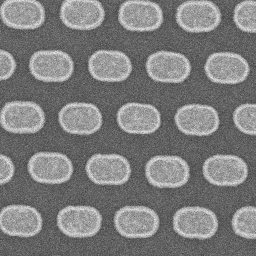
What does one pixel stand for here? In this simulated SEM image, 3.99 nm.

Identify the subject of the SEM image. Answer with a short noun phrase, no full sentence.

a regular array of raised bodies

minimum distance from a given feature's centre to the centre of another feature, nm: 231